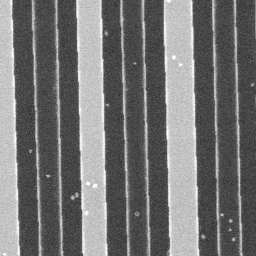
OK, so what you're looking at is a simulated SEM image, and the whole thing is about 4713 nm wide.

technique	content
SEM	lines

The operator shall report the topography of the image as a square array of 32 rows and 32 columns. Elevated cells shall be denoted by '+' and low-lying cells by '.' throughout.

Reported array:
+...+++...+++..+++...+++...++...
+...+++...+++..+++...+++...++...
+...+++...+++..+++...+++...++...
++..+++...+++..+++...+++...++...
++..+++...+++..+++...+++...++...
++..+++...+++..+++...+++...++...
++..+++...+++..+++...+++...++...
++..+++...+++..+++...+++...++...
++..+++...+++..+++...+++...++...
++..+++...+++..+++...+++...+++..
++..+++...+++..+++...+++...+++..
++..+++...+++..+++...+++...+++..
++..+++...+++..+++...+++...+++..
++...++...+++...++...+++...+++..
++...++...+++...++...+++...+++..
++...++...+++...++...+++...+++..
++...++...+++...++...+++...+++..
++...++...+++...++...+++...+++..
++...++...+++...++...+++...+++..
++...++...+++...++...+++...+++..
++...++...+++...++...+++...+++..
++...++...+++...++...+++...+++..
++...++...+++...++...+++...+++..
++...++...+++...++...+++...+++..
++...++...+++...++...++++..+++..
++...+++..+++...++...++++..+++..
++...+++..+++...++...++++..+++..
++...+++..+++...+++..++++..+++..
++...+++..+++...+++..++++..+++..
++...+++..+++...+++..++++..+++..
++...+++..+++...+++..++++..+++..
++...+++..+++...+++..++++..+++..